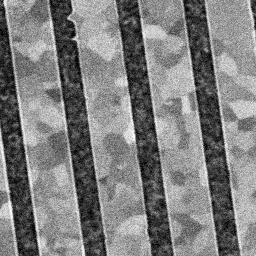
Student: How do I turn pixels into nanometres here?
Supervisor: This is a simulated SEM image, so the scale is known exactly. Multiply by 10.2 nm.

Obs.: one or a few lines or trenches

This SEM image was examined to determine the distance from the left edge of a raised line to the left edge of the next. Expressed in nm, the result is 679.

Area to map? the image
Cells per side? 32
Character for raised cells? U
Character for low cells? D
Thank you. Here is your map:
DUUUUUDDDUUUUUDDDUUUUUUDDDUUUUUD
DUUUUUDDDUUUUUUDDDUUUUUDDDUUUUUD
DUUUUUDDDUUUUUUDDDUUUUUDDDUUUUUU
DUUUUUUDDDUUUUUDDDUUUUUDDDUUUUUU
DUUUUUUDDUUUUUUDDDUUUUUDDDUUUUUU
DUUUUUUDDDUUUUUDDDUUUUUDDDUUUUUU
DDUUUUUDDDUUUUUDDDUUUUUUDDDUUUUU
DDUUUUUDDDUUUUUDDDUUUUUUDDDUUUUU
DDUUUUUDDDUUUUUUDDDUUUUUDDDUUUUU
DDUUUUUDDDUUUUUUDDDUUUUUDDDUUUUU
DDUUUUUUDDUUUUUUDDDUUUUUDDDUUUUU
DDUUUUUUDDDUUUUUDDDUUUUUDDDUUUUU
DDUUUUUUDDDUUUUUDDDUUUUUUDDUUUUU
DDDUUUUUDDDUUUUUDDDUUUUUUDDDUUUU
DDDUUUUUDDDUUUUUDDDUUUUUUDDDUUUU
DDDUUUUUDDDUUUUUUDDDUUUUUDDDUUUU
DDDUUUUUDDDUUUUUUDDDUUUUUDDDUUUU
DUDUUUUUDDDUUUUUUDDDUUUUUDDDUUUU
DDDUUUUUUDDDUUUUUDDDUUUUUDDDUUUU
DDDUUUUUUDDDUUUUUDDDUUUUUDDDUUUU
UDDUUUUUUDDDUUUUUDDDUUUUUUDDDUUU
UDDDUUUUUDDDUUUUUUDDUUUUUUDDDUUU
UDDDUUUUUDDDUUUUUUDDDUUUUUDDDUUU
UDDDUUUUUDDDUUUUUUDDDUUUUUDDDUUU
UDDDUUUUUDDDUUUUUUDDDUUUUUDDDUUU
UDDDUUUUUUDDDUUUUUDDDUUUUUDDDUUU
UDDDUUUUUUDDDUUUUUDDDUUUUUDDDUUU
UUDDUUUUUUDDDUUUUUDDDUUUUUUDDDUU
UUDDDUUUUUDDDUUUUUDDDUUUUUUDDDUU
UUDDDUUUUUDDDUUUUUDDDUUUUUUDDDUU
UUDDDUUUUUDDDUUUUUUDDDUUUUUDDDUU
UUDDDUUUUUDDDUUUUUUDDDUUUUUDDDUU